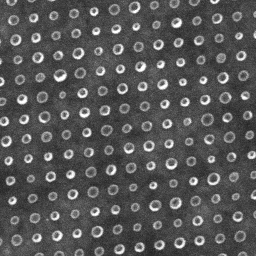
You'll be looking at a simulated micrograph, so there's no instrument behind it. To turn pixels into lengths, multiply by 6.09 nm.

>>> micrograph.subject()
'a regular array of raised bodies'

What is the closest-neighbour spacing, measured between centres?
120 nm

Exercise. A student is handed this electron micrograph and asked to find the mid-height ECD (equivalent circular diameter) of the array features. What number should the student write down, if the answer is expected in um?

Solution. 0.0558